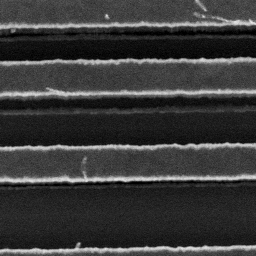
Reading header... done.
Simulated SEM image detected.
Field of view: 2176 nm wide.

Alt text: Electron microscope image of lines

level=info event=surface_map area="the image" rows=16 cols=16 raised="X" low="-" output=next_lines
XXXXXXXXXXXXXXXX
XXXXXXXXXXXXXXXX
----------------
----------------
XXXXXXXXXXXXXXXX
XXXXXXXXXXXXXXXX
----------------
----------------
----------------
XXXXXXXXXXXXXXXX
XXXXXXXXXXXXXXXX
----------------
----------------
----------------
----------------
---------XXXXXXX